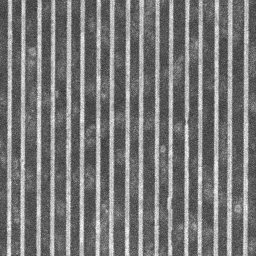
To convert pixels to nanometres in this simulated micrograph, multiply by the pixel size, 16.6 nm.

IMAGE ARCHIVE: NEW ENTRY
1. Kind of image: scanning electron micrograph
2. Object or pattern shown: parallel lines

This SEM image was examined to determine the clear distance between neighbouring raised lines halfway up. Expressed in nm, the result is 193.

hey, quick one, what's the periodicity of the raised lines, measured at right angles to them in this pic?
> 245 nm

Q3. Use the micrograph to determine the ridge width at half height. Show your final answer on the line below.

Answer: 39.4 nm